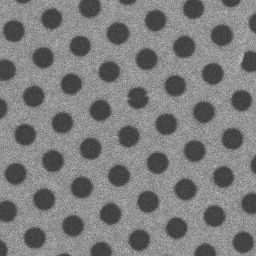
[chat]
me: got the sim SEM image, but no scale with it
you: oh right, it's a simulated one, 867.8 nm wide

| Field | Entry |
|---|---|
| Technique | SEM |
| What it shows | a regular array of holes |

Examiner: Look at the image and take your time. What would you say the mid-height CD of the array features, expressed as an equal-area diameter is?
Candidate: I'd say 71.8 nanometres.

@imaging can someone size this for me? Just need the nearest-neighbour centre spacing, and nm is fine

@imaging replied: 132